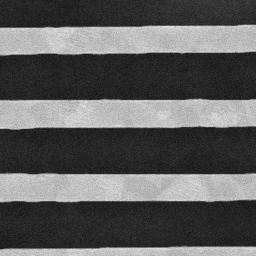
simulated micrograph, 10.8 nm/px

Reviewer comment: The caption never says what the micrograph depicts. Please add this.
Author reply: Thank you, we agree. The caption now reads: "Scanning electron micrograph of lines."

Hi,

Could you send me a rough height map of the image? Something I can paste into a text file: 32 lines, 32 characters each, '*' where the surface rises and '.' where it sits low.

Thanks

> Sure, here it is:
................................
................................
................................
........*.**********************
********************************
********************************
*******************************.
................................
................................
................................
................................
................................
........................**......
********************************
********************************
********************************
................................
................................
................................
................................
................................
................................
********************************
********************************
********************************
................................
................................
................................
................................
................................
................................
********************************